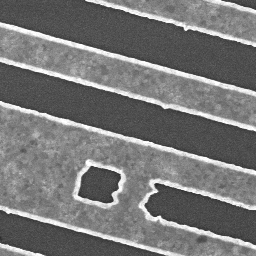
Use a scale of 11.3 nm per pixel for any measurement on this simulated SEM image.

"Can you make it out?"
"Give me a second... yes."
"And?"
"one or a few lines or trenches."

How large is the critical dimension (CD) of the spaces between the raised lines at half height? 479 nanometers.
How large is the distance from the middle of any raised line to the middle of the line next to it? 847 nm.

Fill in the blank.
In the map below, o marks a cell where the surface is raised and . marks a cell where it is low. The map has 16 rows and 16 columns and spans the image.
.......oooooooo.
...........ooooo
oooo...........o
ooooooo.........
...oooooooo.....
......ooooooooo.
..........oooooo
oooo..........oo
ooooooo.........
ooooooooooo.....
ooooo..oooooooo.
ooooo...oo.ooooo
ooooo..oo.....oo
..ooooooo.......
.....oooooooo...
o........ooooooo